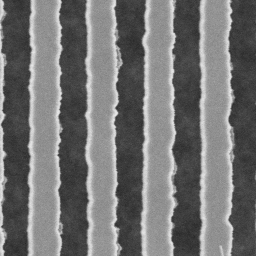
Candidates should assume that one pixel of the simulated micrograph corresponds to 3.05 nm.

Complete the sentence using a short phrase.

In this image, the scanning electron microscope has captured lines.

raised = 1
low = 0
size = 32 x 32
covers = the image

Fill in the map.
00001111000111000011110001111000
00001110000111000011110001111000
00001110000111000011110001111000
00001111000111000011110001111000
00001111000111000011110001111000
00001111000111000011110001111000
00001111000111100011100001111000
00001110000111100011110001111000
00001111000111100011110001111000
00001111000111100011110001111000
00001110000111000011110001111000
00001111000111100011110001111000
00001111000111100011110001111000
00001110000111000011110001111000
00001110000111100011110001111000
00001110000111000011110001111000
00001110000111000011110001111000
00001111000111000011110001111000
00001110000111000011100001111000
00001110000111000011110001111000
00001110000111000011110001111000
00001110000111100011110001111000
00001111000111100011100001111000
00001110000111000011110001111000
00001110000111000011110001111000
00001110000111100011110001111000
00001110000111000011110001111000
00001110000111000011100001111000
00001110000111000011100001111000
10001111000111100011100001111000
00001111000111100011110001111000
00001111000111100011110001111000